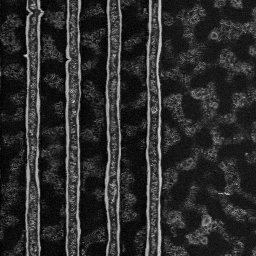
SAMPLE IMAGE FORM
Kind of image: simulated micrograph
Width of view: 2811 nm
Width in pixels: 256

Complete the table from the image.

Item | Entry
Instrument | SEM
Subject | parallel lines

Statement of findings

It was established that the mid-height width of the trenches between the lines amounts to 0.316 microns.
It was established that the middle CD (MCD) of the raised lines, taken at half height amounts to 0.13 micrometres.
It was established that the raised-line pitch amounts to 443 nm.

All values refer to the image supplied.